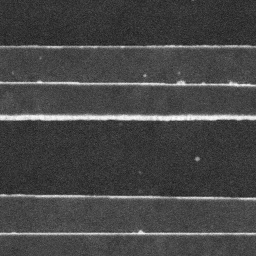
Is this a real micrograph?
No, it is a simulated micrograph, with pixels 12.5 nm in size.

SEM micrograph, lines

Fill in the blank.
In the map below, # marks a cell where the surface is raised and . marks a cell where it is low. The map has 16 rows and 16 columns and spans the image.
................
................
................
################
################
################
################
................
................
................
................
................
################
################
################
################